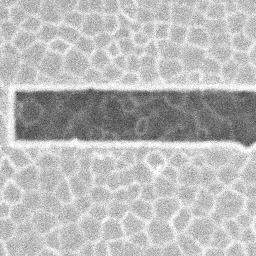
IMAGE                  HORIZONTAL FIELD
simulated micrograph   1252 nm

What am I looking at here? one or a few lines or trenches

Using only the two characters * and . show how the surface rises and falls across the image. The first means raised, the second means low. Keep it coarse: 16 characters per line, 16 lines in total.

****************
****************
****************
****************
****************
*...............
*...............
*...............
*...............
****************
****************
****************
****************
****************
****************
****************